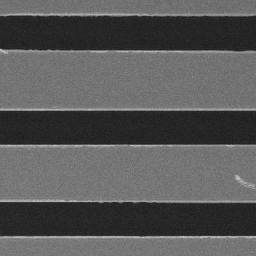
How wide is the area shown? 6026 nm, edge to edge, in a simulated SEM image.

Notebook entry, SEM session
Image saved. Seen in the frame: lines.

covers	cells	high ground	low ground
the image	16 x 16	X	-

XXXXXXXXXXXXXXXX
----------------
----------------
XXXXXXXXXXXXXXXX
XXXXXXXXXXXXXXXX
XXXXXXXXXXXXXXXX
XXXXXXXXXXXXXXXX
----------------
----------------
XXXXXXXXXXXXXXXX
XXXXXXXXXXXXXXXX
XXXXXXXXXXXXXXXX
XXXXXXXXXXXXXXXX
----------------
----------------
XXXXXXXXXXXXXXXX